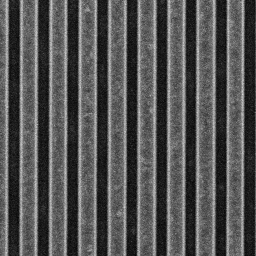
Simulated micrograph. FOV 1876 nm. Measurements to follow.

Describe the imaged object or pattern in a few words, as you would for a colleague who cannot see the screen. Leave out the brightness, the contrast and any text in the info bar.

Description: parallel lines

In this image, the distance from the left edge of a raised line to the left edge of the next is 216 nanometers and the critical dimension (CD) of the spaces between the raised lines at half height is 13.1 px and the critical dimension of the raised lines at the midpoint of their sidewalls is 122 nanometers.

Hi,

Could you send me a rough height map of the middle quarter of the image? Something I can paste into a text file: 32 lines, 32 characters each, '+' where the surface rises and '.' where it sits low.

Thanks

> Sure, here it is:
....++++...++++....++++...++++..
....++++...++++....++++...++++..
....++++...++++....++++...++++..
....++++...++++....++++...++++..
....++++...++++....++++...++++..
....++++...++++....++++...++++..
....++++...++++....++++...++++..
....++++...++++....++++...++++..
....++++...++++....++++...++++..
+...++++...++++....++++...++++..
+...++++...++++....++++...++++..
+...++++...++++....++++...++++..
+...++++...++++....++++...++++..
+...++++...++++....++++...++++..
+...++++...++++....++++...++++..
+...++++...++++....++++...++++..
+...++++...++++....++++...++++..
+...++++...++++....++++...++++..
+...++++...++++....++++...++++..
+...++++...++++....++++...++++..
+...++++...++++....++++...++++..
+...++++...++++....++++...++++..
....++++...++++....++++...++++..
....++++...++++....++++...++++..
....++++...++++....++++...++++..
....++++...++++....++++...++++..
....++++...++++....++++...++++..
....++++...++++....++++...++++..
....++++...++++....++++...++++..
....++++...++++....++++...++++..
....++++...++++....++++...++++..
....++++...++++....++++...++++..